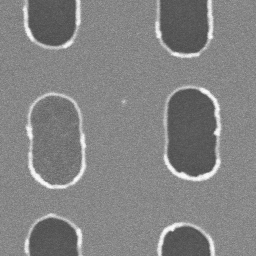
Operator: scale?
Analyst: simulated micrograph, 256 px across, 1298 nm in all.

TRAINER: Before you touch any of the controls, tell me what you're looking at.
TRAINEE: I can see holes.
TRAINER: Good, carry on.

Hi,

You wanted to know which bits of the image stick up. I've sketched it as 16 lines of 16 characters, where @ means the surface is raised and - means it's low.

@@---@@@@@---@@@
@@---@@@@@---@@@
@@--@@@@@@---@@@
@@@@@@@@@@@@@@@@
@@@@@@@@@@@@@@@@
@@@@@@@@@@@@@@@@
@@---@@@@@---@@@
@@---@@@@@----@@
@@---@@@@@----@@
@@---@@@@@----@@
@@---@@@@@@--@@@
@@@-@@@@@@@@@@@@
@@@@@@@@@@@@@@@@
@@@@@@@@@@@@@@@@
@@---@@@@@@--@@@
@@---@@@@@---@@@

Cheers